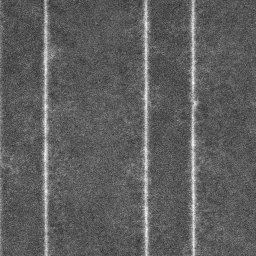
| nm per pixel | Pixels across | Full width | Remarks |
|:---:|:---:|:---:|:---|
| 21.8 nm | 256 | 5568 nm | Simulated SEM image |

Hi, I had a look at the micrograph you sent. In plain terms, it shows one or a few lines or trenches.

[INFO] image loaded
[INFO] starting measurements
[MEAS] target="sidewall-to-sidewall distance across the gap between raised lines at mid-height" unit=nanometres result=1030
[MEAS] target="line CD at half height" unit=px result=100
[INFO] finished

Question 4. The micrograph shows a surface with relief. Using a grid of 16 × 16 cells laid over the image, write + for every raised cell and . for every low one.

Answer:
...++++++...++++
...++++++...++++
...++++++...++++
...++++++...++++
...++++++...++++
...++++++...++++
...++++++...++++
...++++++...++++
...++++++...++++
...++++++...++++
...++++++...++++
...++++++...++++
...++++++...++++
...++++++...++++
...++++++...++++
...++++++...++++